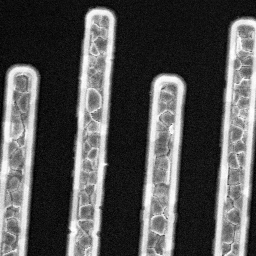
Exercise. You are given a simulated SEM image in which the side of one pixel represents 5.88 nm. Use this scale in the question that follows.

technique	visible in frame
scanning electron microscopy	one or a few lines or trenches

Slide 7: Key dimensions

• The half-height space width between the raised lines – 0.285 µm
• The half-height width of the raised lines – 145 nm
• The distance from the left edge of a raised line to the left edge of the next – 0.429 micrometres